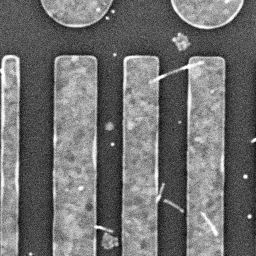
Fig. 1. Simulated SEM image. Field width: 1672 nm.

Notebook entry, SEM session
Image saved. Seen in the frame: groups of lines, slits or small figures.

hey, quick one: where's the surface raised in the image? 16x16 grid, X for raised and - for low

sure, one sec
---XXXX----XXXX-
----XX------XX--
----------------
----X-----------
X--XXX--XX--XX--
X--XXX--XX--XX--
X--XXX--XX--XX--
X--XXX--XX--XX--
X--XXX--XX--XX--
X--XXX--XX--XX--
X--XXX--XX--XX--
X--XXX--XX--XX--
X--XXX--XX--XX--
X--XXX--XX--XX--
X--XXX--XX--XX--
X--XXX--XX--XX--